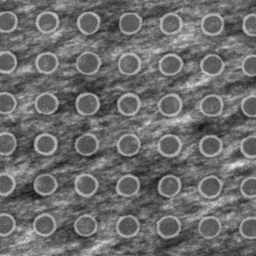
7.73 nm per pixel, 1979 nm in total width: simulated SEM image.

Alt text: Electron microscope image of a regular array of raised bodies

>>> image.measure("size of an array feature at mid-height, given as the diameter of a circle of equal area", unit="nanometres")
160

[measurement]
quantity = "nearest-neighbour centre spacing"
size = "313 nm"